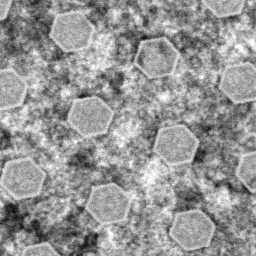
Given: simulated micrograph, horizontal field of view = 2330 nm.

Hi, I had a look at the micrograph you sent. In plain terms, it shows raised bodies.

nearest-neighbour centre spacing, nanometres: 791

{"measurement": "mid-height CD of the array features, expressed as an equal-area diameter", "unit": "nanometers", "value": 367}